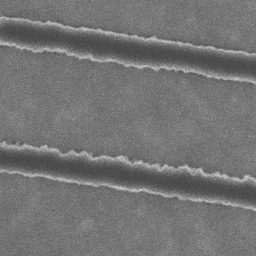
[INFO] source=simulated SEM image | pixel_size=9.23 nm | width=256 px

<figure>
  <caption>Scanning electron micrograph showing one or a few lines or trenches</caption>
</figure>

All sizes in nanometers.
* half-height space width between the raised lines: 883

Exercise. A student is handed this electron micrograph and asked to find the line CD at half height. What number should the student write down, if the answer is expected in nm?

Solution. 269